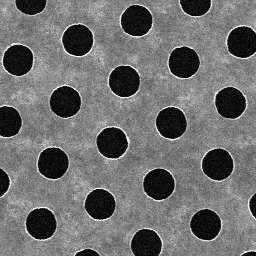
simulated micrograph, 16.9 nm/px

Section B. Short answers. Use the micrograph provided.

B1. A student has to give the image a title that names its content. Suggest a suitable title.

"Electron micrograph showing a regular array of holes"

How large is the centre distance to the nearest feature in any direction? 1040 nm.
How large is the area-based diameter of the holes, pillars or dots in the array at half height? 0.532 microns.